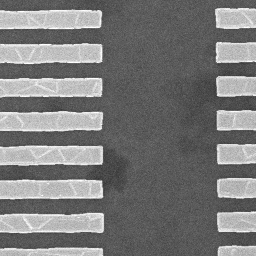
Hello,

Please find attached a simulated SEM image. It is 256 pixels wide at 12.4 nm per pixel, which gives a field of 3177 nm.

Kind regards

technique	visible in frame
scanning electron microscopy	wiring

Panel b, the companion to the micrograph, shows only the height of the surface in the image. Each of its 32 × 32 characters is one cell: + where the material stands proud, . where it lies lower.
................................
++++++++++++...............+++++
+++++++++++++..............+++++
++....++++......................
................................
...........................+++++
+++++++++++++..............+++++
+++++++++++++..............+++++
................................
................................
+++++++++++++..............+++++
+++++++++++++..............+++++
................................
................................
+++++++++++++..............+++++
+++++++++++++..............+++++
................................
................................
+++++++++++++..............+++++
+++++++++++++..............+++++
+++++++.++++....................
................................
............................++++
+++++++++++++..............+++++
+++++++++++++...............++++
................................
................................
+++++++++++++..............+++++
+++++++++++++..............+++++
................................
................................
+++++++++++++..............+++++